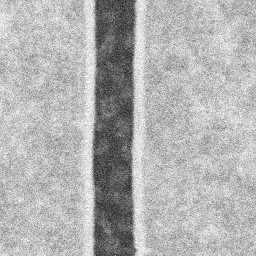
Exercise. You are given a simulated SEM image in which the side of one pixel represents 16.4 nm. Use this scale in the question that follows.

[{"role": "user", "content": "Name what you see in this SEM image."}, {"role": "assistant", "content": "one or a few lines or trenches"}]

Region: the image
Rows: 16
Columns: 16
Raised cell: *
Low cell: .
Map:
******...*******
******...*******
******...*******
******...*******
******...*******
******...*******
******...*******
******...*******
******...*******
*****....*******
*****....*******
*****....*******
******...*******
******...*******
*****....*******
*****....*******